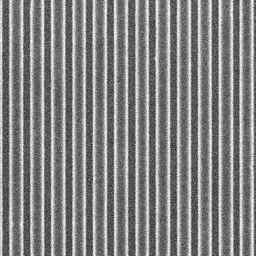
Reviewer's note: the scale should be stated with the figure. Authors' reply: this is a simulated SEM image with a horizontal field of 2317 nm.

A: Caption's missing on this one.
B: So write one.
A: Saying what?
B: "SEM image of parallel lines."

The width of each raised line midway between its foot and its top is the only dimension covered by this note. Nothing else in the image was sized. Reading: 122 nm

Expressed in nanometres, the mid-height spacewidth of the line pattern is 70.1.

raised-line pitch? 20.9 px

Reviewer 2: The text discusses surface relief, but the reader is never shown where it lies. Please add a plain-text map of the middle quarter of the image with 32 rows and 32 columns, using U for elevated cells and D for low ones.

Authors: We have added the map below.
DDUUUDDUUUUDDUUUDDUUUDDUUUDDUUUU
DDUUUDDUUUUDDUUUDDUUUDDUUUDDUUUD
DDUUUDDUUUUDDUUUDDUUUDDUUUDDUUUD
DDUUUDDUUUUDDUUUDDUUUDDUUUDDUUUD
DDUUUDDUUUUDDUUUDDUUUDDUUUDDUUUD
DDUUUDDUUUUDDUUUDDUUUDDUUUDDUUUD
DDUUUDDUUUUDDUUUDDUUUDDUUUDDUUUD
DDUUUDDUUUUDDUUUDDUUUDDUUUDDUUUD
DDUUUDDUUUUDDUUUDDUUUDDUUUDDUUUD
DDUUUDDUUUUDDUUUDDUUUDDUUUDDUUUD
DDUUUDDUUUUDDUUUDDUUUDDUUUDDUUUD
DDUUUDDUUUUDDUUUDDUUUDDUUUDDUUUD
DDUUUDDUUUUDDUUUDDUUUDDUUUDDUUUD
DDUUUDDUUUUDDUUUDDUUUDDUUUDDUUUD
DDUUUDDUUUUDDUUUDDUUUDDUUUDDUUUD
DDUUUDDUUUUDDUUUDDUUUDDUUUDDUUUD
DDUUUDDUUUUDDUUUDDUUUDDUUUDDUUUD
DDUUUDDUUUUDDUUUDDUUUDDUUUDDUUUD
DDUUUDDUUUUDDUUUDDUUUDDUUUDDUUUD
DDUUUDDUUUUDDUUUDDUUUDDUUUDDDUUD
DDUUUDDUUUUDDUUUDDUUUDDUUUDDDUUD
DDUUUDDUUUUDDUUUDDUUUDDUUUDDDUUD
DDUUUDDUUUUDDUUUDDUUUDDUUUDDDUUD
DDUUUDDUUUUDDUUUDDUUUDDUUUDDDUUD
DDUUUDDUUUUDDUUUDDUUUDDUUUDDDUUD
DDUUUDDUUUUDDUUUDDUUUDDUUUDDDUUD
DDUUUDDUUUUDDUUUDDUUUDDUUUDDDUUD
DDUUUDDUUUUDDUUUDDUUUDDUUUDDDUUD
DDUUUDDUUUUDDUUUDDUUUDDUUUDDDUUD
DDUUUDDUUUUDDUUUDDUUUDDUUUDDDUUD
DDUUUDDUUUUDDUUUDDUUUDDUUUDDDUUD
DDUUUDDUUUUDDUUUDDUUUDDUUUDDDUUD